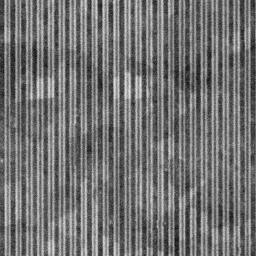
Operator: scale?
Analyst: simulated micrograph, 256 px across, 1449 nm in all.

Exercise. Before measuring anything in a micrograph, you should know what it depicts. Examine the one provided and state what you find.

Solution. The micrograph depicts parallel lines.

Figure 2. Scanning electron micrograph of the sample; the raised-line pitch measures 61.9 nanometers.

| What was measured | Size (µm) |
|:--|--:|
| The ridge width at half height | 0.0276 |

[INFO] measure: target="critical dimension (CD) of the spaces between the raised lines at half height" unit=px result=5.88